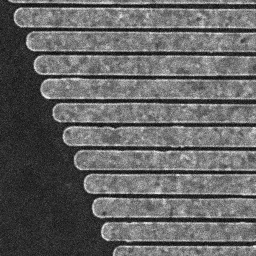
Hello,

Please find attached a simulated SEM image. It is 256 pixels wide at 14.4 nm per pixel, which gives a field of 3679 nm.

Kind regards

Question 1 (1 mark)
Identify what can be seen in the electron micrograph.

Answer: parallel lines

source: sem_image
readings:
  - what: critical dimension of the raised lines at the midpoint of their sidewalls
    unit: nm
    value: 262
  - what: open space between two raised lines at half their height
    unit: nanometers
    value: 79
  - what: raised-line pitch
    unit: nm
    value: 341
